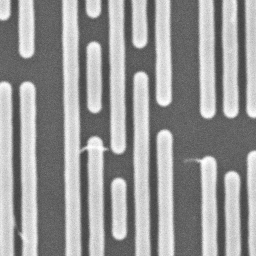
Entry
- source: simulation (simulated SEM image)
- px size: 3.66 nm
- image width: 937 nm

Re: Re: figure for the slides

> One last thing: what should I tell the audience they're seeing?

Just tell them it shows groups of lines, slits or small figures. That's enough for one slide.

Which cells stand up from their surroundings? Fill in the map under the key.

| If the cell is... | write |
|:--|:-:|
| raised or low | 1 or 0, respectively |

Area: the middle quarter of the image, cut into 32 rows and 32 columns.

11110011100011100000000111100000
11110011100011100000000111100000
11110011100011100011000111100000
11110011100011100011100111100000
11100011100011100011100111100000
11100011100011100011100111100000
11110011100011100011100111100000
11110011100011100011100111100000
11110011100011100011100111100000
11110011100011100011100111000000
11110011100011100011100000000000
11110011100011100011100000000000
11110000000011100011100000000000
11110000000011100011100000000000
11110000000011100011100000000000
11110000000011100011100000000000
11110000000011100011100000000000
11110000000011100011100011100000
11110001100011100011100111100000
11110011100011100011100111100000
11110011100011100011100111100000
01110011110011100011100111100000
01110011100000000011100111100000
01110011100000000011100111100000
01110011100000000011100011100000
01110011100000000011100011100000
01110011100000000011100011100000
01110011100000000011100011100000
01110011100000000011100011100000
01110011100011100011100011100000
01110011110011100011100011100000
01110011110011100011100011100000